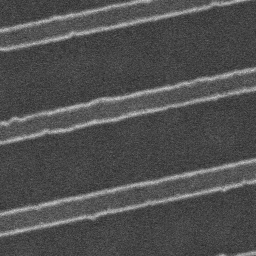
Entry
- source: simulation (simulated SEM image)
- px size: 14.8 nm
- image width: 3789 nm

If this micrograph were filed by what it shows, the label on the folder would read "one or a few lines or trenches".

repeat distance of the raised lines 90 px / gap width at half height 1030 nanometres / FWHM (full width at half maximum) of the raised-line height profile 300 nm